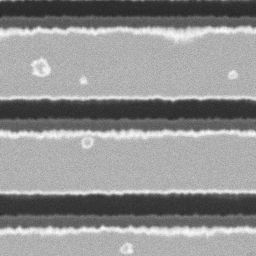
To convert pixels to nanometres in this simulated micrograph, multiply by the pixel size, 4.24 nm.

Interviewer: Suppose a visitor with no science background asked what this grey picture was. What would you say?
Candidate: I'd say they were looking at lines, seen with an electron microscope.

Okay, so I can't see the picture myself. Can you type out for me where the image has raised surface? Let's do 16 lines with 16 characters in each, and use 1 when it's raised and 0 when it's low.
0000000000000000
0000000000000000
1111111111111111
1111111111111111
1111111111111111
1111111111111111
0000000000000000
0000000000000000
1111111111111111
1111111111111111
1111111111111111
1111111111111111
0000000000000000
0000000000000000
1111111111111111
1111111111111111